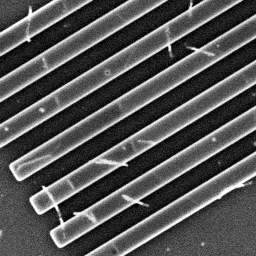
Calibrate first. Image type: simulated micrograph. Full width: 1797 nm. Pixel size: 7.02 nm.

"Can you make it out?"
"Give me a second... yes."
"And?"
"groups of lines, slits or small figures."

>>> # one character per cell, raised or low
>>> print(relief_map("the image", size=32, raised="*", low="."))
......*****.....****.....****...
....*****.....****.....*****....
...****.....*****.....****.....*
.*****....*****.....****.....***
****.....****.....*****.....****
***....*****.....****.....*****.
*.....****.....*****....*****...
....*****....*****.....****.....
..*****.....****.....*****....**
.****.....*****....*****.....***
****....*****.....****.....*****
**.....****.....*****.....****..
.....*****.....****.....*****...
....****.....****.....*****.....
..****.....*****.....****.....**
*****.....****.....****.....****
***.....****.....*****.....****.
**....*****.....****.....*****..
.....****.....*****....*****....
...*****....*****.....****.....*
..****.....*****....*****.....**
..**.....*****....*****.....****
.......*****.....****.....*****.
......****.....*****.....****...
....*****.....****.....*****....
....***.....*****....*****......
.....*....*****.....****........
.........****.....*****.........
.......*****....*****...........
.......***.....****.............
.......*.....*****..............
............****................